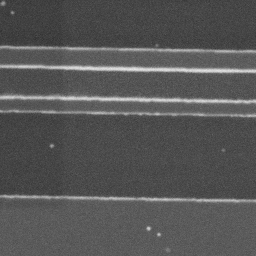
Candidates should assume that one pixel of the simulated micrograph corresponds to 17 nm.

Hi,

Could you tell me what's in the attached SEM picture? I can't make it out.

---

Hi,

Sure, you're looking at lines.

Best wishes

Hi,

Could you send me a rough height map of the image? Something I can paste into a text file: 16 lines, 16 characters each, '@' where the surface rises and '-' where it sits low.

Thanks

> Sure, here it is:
----------------
----------------
----------------
@@@@@@@@@@@@@@@@
@@@@@@@@@@@@@@@@
@@@@@@@@@@@@@@@@
@@@@@@@@@@@@@@@@
----------------
----------------
----------------
----------------
----------------
@@@@@@@@@@@-----
@@@@@@@@@@@@@@@@
@@@@@@@@@@@@@@@@
@@@@@@@@@@@@@@@@